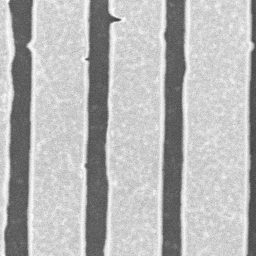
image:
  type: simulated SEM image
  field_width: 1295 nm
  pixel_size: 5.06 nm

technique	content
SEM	one or a few lines or trenches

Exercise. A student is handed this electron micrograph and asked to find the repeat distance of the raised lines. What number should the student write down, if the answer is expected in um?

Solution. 0.399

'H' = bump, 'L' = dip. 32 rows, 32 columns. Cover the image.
HLLLHHHHHHHLLLHHHHHHLLLLHHHHHHHL
HLLLHHHHHHHLLLHHHHHHLLLLHHHHHHHL
HLLLHHHHHHHLLLLHHHHHLLLHHHHHHHHL
HLLLHHHHHHHLLLHHHHHHLLLHHHHHHHHL
HLLLHHHHHHHLLLHHHHHHLLLHHHHHHHHL
HLLLHHHHHHHLLLHHHHHHLLLHHHHHHHHL
HLLLHHHHHHHLLLHHHHHHLLLHHHHHHHHL
HLLLHHHHHHHLLLHHHHHHLLLHHHHHHHHL
HLLLHHHHHHHLLLHHHHHHLLLHHHHHHHHL
HLLLHHHHHHHLLLHHHHHHLLLHHHHHHHHL
HLLLHHHHHHHLLLHHHHHHLLLHHHHHHHHL
HLLLHHHHHHHLLLHHHHHHLLLHHHHHHHHL
HLLLHHHHHHHLLLHHHHHHLLLHHHHHHHHL
HLLLHHHHHHHLLLHHHHHHLLLHHHHHHHHL
HLLLHHHHHHHLLLHHHHHHLLLHHHHHHHHL
HLLLHHHHHHHLLLHHHHHHLLLHHHHHHHHL
HLLLHHHHHHHLLHHHHHHHLLLHHHHHHHHL
HLLLHHHHHHHLLLHHHHHHLLLHHHHHHHHL
HLLLHHHHHHHLLLHHHHHHLLLHHHHHHHHL
HLLLHHHHHHLLLHHHHHHHLLLHHHHHHHHL
HLLLHHHHHHLLLHHHHHHHLLLHHHHHHHHL
HLLLHHHHHHHLLLHHHHHHLLLHHHHHHHHL
HLLLHHHHHHHLLLHHHHHHLLLHHHHHHHHL
HLLLHHHHHHLLLLHHHHHHLLLHHHHHHHHL
HLLLHHHHHHLLLLHHHHHHLLLHHHHHHHHL
HLLLHHHHHHLLLLHHHHHHLLLHHHHHHHHL
HLLLHHHHHHLLLLHHHHHHLLLHHHHHHHHL
HLLLHHHHHHLLLLHHHHHHLLLHHHHHHHHL
LLLLHHHHHHLLLLHHHHHHLLLHHHHHHHHL
LLLLHHHHHHLLLLHHHHHHLLLHHHHHHHHL
LLLLHHHHHHLLLHHHHHHHLLLHHHHHHHHL
LLLLHHHHHHLLLHHHHHHHLLLHHHHHHHHL